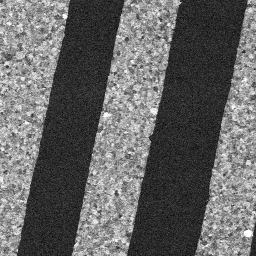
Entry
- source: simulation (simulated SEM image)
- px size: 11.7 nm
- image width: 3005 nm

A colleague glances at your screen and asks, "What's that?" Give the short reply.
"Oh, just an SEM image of one or a few lines or trenches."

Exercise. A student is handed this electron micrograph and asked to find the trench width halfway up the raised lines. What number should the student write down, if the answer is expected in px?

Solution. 60.2